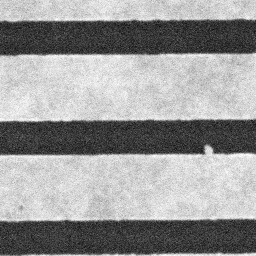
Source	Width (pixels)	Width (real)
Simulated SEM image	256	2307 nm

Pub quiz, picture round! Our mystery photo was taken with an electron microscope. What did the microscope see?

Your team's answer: lines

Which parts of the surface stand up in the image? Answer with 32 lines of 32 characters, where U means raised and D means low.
UUUUUUUUUUUUUUUUUUUUUUUUUUUUUUUU
UUUUUUUUUUUUUUUUUUUUUUUUUUUUUUUU
DUUDDDDDDDDDDDDDDDDDDDDDDDDDDDDD
DDDDDDDDDDDDDDDDDDDDDDDDDDDDDDDD
DDDDDDDDDDDDDDDDDDDDDDDDDDDDDDDD
DDDDDDDDDDDDDDDDDDDDDDDDDDDDDDDD
DDDDDDDDDDDDDDDDDDDDDDDDDDDDDDDD
UUUUUUUUUUUUUUUUUUUUUUUUUUUUUUUU
UUUUUUUUUUUUUUUUUUUUUUUUUUUUUUUU
UUUUUUUUUUUUUUUUUUUUUUUUUUUUUUUU
UUUUUUUUUUUUUUUUUUUUUUUUUUUUUUUU
UUUUUUUUUUUUUUUUUUUUUUUUUUUUUUUU
UUUUUUUUUUUUUUUUUUUUUUUUUUUUUUUU
UUUUUUUUUUUUUUUUUUUUUUUUUUUUUUUU
UUUUUUUUUUUUUUUUUUUUUUUUUUUUUUUU
DDDDDDDDDDDDDDDDDDDDDDDDDDDDDDDD
DDDDDDDDDDDDDDDDDDDDDDDDDDDDDDDD
DDDDDDDDDDDDDDDDDDDDDDDDDDDDDDDD
DDDDDDDDDDDDDDDDDDDDDDDDDDDDDDDD
DDDDDDDDDDDDUUDUUUUUUUUUUUUUUUUU
UUUUUUUUUUUUUUUUUUUUUUUUUUUUUUUU
UUUUUUUUUUUUUUUUUUUUUUUUUUUUUUUU
UUUUUUUUUUUUUUUUUUUUUUUUUUUUUUUU
UUUUUUUUUUUUUUUUUUUUUUUUUUUUUUUU
UUUUUUUUUUUUUUUUUUUUUUUUUUUUUUUU
UUUUUUUUUUUUUUUUUUUUUUUUUUUUUUUU
UUUUUUUUUUUUUUUUUUUUUUUUUUUUUUUU
DUDDDDDDDDDDDDDDDDDDDDDDDDDDDDDD
DDDDDDDDDDDDDDDDDDDDDDDDDDDDDDDD
DDDDDDDDDDDDDDDDDDDDDDDDDDDDDDDD
DDDDDDDDDDDDDDDDDDDDDDDDDDDDDDDD
DDDDDDDDDDDDDDDDDDDDDDDDDDDDDDDD